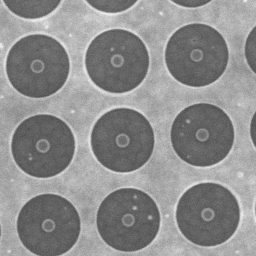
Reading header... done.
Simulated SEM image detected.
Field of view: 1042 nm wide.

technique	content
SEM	an array of small figures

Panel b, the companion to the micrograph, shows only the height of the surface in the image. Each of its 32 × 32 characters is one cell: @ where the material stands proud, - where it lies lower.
@-------@@@------@@@@@----@@@@@@
@------@@@@@@--@@@@@@@@@@@@@@@@@
@@@@-@@@@@@@@@@@@@@@@@@@@@@@@@@@
@@@@@@@@@@@@@@@@@@@@@@-----@@@@@
@@@---@@@@@@-----@@@@-------@@@-
@@------@@@-------@@@-------@@@-
@-------@@@--------@@---@----@@-
@--------@@---@----@@---@----@@-
@---@----@@--------@@-------@@@-
@--------@@-------@@@-------@@@@
@-------@@@@------@@@@@---@@@@@@
@@-----@@@@@@---@@@@@@@@@@@@@@@@
@@@@@@@@@@@@@@@@@@@@@@@@@@@@@@@@
@@@@@@@@@@@@@@--@@@@@@@----@@@@@
@@@@---@@@@@------@@@@-------@@@
@@------@@@@-------@@@-------@@-
@@-------@@--------@@----@---@@-
@--------@@----@---@@--------@@-
@----@---@@--------@@@-------@@@
@--------@@@-------@@@------@@@@
@@-------@@@@-----@@@@@@---@@@@@
@@@-----@@@@@@---@@@@@@@@@@@@@@@
@@@@@@@@@@@@@@@@@@@@@@@@@@@@@@@@
@@@@@@@@@@@@@@@--@@@@@@@-----@@@
@@@@@---@@@@@------@@@@-------@@
@@@------@@@@-------@@--------@@
@@--------@@--------@@--------@@
@@--------@@---@@---@@--------@@
@@----@---@@--------@@--------@@
@@--------@@@-------@@@------@@@
@@@------@@@@------@@@@@----@@@@
@@@@----@@@@@@@@@@@@@@@@@@@@@@@@